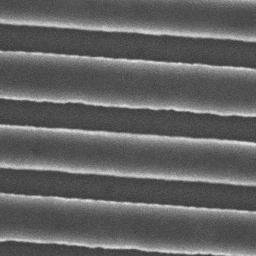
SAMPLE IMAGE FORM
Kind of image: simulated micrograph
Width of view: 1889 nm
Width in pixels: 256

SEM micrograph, lines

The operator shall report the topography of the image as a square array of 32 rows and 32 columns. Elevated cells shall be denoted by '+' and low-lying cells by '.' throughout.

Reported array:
++++++++++++++++++++++++++++++++
++++++++++++++++++++++++++++++++
++++++++++++++++++++++++++++++++
..........++++++++++++++++++++++
........................++++++++
................................
................................
++++++++++++++++................
+++++++++++++++++++++++++++++++.
++++++++++++++++++++++++++++++++
++++++++++++++++++++++++++++++++
++++++++++++++++++++++++++++++++
....++++++++++++++++++++++++++++
..................++++++++++++++
................................
................................
++++++++++++....................
++++++++++++++++++++++++........
++++++++++++++++++++++++++++++++
++++++++++++++++++++++++++++++++
++++++++++++++++++++++++++++++++
..........++++++++++++++++++++++
.........................+++++++
................................
+++.............................
++++++++++++++++++..............
+++++++++++++++++++++++++++++++.
++++++++++++++++++++++++++++++++
++++++++++++++++++++++++++++++++
++++++++++++++++++++++++++++++++
........++++++++++++++++++++++++
....................++++++++++++